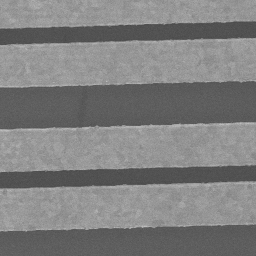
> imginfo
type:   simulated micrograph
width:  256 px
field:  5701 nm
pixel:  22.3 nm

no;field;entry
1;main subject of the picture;lines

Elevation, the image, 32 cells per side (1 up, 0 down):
11111111111111111111111111111111
11111111111111111111111111111111
11111111111111111111111111111111
00000000000000000000000000000000
00000000000000000000000000000000
00000111111111111111111111111111
11111111111111111111111111111111
11111111111111111111111111111111
11111111111111111111111111111111
11111111111111111111111111111111
11111111111111100000000000000000
00000000000000000000000000000000
00000000000000000000000000000000
00000000000000000000000000000000
00000000000000000000000000000000
00000000000000000000000011111111
11111111111111111111111111111111
11111111111111111111111111111111
11111111111111111111111111111111
11111111111111111111111111111111
11111111111111111111111111111111
00000000000000000000000000000000
00000000000000000000000000000000
00000001111111111111111111111111
11111111111111111111111111111111
11111111111111111111111111111111
11111111111111111111111111111111
11111111111111111111111111111111
11111111111100000000000000000000
00000000000000000000000000000000
00000000000000000000000000000000
00000000000000000000000000000000